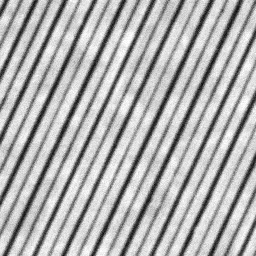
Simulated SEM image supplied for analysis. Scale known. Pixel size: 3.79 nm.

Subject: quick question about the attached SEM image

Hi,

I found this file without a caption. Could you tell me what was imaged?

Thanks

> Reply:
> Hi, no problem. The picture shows parallel lines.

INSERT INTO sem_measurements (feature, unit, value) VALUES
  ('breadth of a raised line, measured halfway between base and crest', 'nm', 32.2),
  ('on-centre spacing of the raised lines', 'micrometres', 0.0504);